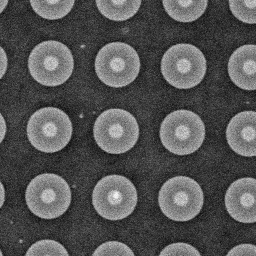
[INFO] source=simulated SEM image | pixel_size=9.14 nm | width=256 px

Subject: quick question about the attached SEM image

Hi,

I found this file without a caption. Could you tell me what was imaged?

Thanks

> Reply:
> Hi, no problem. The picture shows an array of small figures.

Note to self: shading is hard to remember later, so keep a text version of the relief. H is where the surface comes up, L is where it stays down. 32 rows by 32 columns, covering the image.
HLLLHHHHHLLLHHHHHHLLHHHHHHLLLHHH
LLLLLHHHHLLLLHHHHLLLLHHHHLLLLHHH
LLLLLLLLLLLLLLHHLLLLLLHHLLLLLLHH
LLLLLLLLLLLLLLLLLLLLLLLLLLLLLLLL
LLLLLLLLLLLLLLLLLLLLLLLLLLLLLLLL
LLLLLHHHLLLLLLHHLLLLLLLLLLLLLLLL
HLLLHHHHHLLLHHHHHLLLLHHHHLLLLHHH
HLLLHHHHHLLLHHHHHLLLHHHHHHLLLHHH
HLLLHHHHHLLLHHHHHLLLHHHHHHLLLHHH
LLLLHHHHHLLLHHHHHLLLHHHHHLLLLHHH
LLLLLHHHLLLLLHHHLLLLLHHHHLLLLHHH
LLLLLLLLLLLLLLLLLLLLLLLLLLLLLLLL
LLLLLLLLLLLLLLLLLLLLLLLLLLLLLLLL
LLLLLHHLLLLLLLLLLLLLLLLLLLLLLLLL
LLLLHHHHLLLLHHHHHLLLLHHHHLLLLHHH
HLLHHHHHHLLLHHHHHLLLHHHHHLLLLHHH
HLLHHHHHHLLLHHHHHLLLHHHHHHLLHHHH
LLLLHHHHHLLLHHHHHLLLHHHHHLLLHHHH
LLLLLHHHLLLLLHHHLLLLLHHHHLLLLHHH
LLLLLLLLLLLLLLLLLLLLLLLLLLLLLLLH
LLLLLLLLLLLLLLLLLLLLLLLLLLLLLLLL
LLLLLLLLLLLLLLLLLLLLLLLLLLLLLLLL
LLLLHHHHLLLLLHHHLLLLLHHHLLLLLLHH
LLLHHHHHHLLLHHHHHLLLHHHHHLLLLHHH
HLLHHHHHHLLLHHHHHLLLHHHHHLLLHHHH
LLLHHHHHHLLLHHHHHLLLHHHHHLLLHHHH
LLLLHHHHLLLLHHHHLLLLHHHHHLLLLHHH
LLLLLLLLLLLLLLLLLLLLLLHHLLLLLLHH
LLLLLLLLLLLLLLLLLLLLLLLLLLLLLLLL
LLLLLLLLLLLLLLLLLLLLLLLLLLLLLLLL
LLLLHHHLLLLLLHHLLLLLLHHLLLLLLLLL
LLLHHHHHLLLLHHHHHLLLHHHHHLLLLHHH